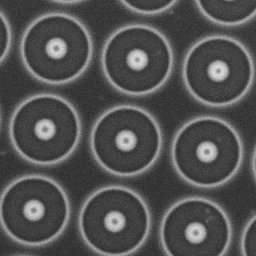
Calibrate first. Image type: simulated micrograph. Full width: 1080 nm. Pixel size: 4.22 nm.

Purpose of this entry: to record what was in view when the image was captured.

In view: an array of small figures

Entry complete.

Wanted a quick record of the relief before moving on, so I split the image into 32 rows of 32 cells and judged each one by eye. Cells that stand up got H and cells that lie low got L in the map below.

HHHHHHHHHHHHHHHHLLLLLHHHHLLLLLLL
HHHHHHHHHHHHHHHHHHHHHHHHHHLLLLLL
HHHHHLLLLHHHHHHHHHHHHHHHHHHLLLHH
LHHHLLLLLLHHHHHHLLHHHHHHHHHHHHHH
LHHLLLLLLLLHHHLLLLLLHHHHHHHHHHHH
LHHLLLHHLLLHHHLLLLLLLHHHHLLLLLHH
LHHLLLHHLLLHHLLLLLLLLHHHLLLLLLLH
HHHLLLLLLLLHHLLLHHLLLHHLLLLLLLLH
HHHHLLLLLLHHHLLLLLLLLHHLLLLHLLLH
HHHHHLLLLHHHHHLLLLLLLHHLLLLHLLLH
HHHHHHHHHHHHHHLLLLLLHHHHLLLLLLLH
HHHHHHHHHHHHHHHHHLHHHHHHLLLLLLHH
HHHHLLLHHHHHHHHHHHHHHHHHHLLLLHHH
HHHLLLLLLHHHHHHHHHHHHHHHHHHHHHHH
HHLLLLLLLHHHHLLLLLHHHHHHHHHHHHHH
HHLLLHLLLLHHLLLLLLLHHHHHLLLLHHHH
HHLLLHLLLLHHLLLLLLLLHHHLLLLLLHHH
HHLLLLLLLHHHLLLHHLLLHHLLLLLLLLHH
HHLLLLLLLHHHLLLLLLLLHHLLLHHLLLHH
HHHLLLLLHHHHLLLLLLLHHHLLLHHLLLHH
HHHHHHHHHHHHHLLLLLLHHHLLLLLLLLHH
HHHHHHHHHHHHHHHLLHHHHHHLLLLLLHHH
HHHLLLHHHHHHHHHHHHHHHHHHLLLLHHHH
HLLLLLLHHHHHHHHHHHHHHHHHHHHHHHHH
HLLLLLLLHHHHLLLLLHHHHHHHHHHHHHHH
LLLLHLLLHHHLLLLLLLHHHHLLLLHHHHHH
LLLHHLLLHHLLLLLLLLHHHLLLLLLLHHHH
LLLLLLLLHHLLLLHLLLHHHLLLLLLLHHHH
HLLLLLLLHHLLLLHLLLHHLLLLHLLLLHHL
HHLLLLLHHHHLLLLLLLHHLLLLHLLLLHHL
HHHHHHHHHHHLLLLLLHHHHLLLLLLLHHLL
HHHHHHHHHHHHHLLLHHHHHLLLLLLLHHHL